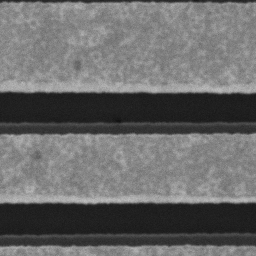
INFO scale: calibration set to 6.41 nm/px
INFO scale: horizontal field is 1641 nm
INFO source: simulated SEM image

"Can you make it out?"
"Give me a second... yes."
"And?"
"lines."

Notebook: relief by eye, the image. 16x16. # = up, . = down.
################
################
################
################
################
################
................
................
################
################
################
################
################
................
................
################